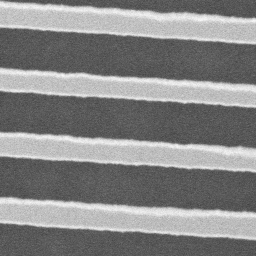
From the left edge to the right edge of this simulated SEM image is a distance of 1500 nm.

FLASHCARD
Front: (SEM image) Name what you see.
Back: lines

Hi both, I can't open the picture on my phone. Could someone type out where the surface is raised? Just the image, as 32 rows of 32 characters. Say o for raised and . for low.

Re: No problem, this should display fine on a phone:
oooo............................
ooooooooooooooooooo.............
oooooooooooooooooooooooooooooooo
...ooooooooooooooooooooooooooooo
.................ooooooooooooooo
................................
................................
................................
................................
ooooooooooooo...................
oooooooooooooooooooooooooooo....
....oooooooooooooooooooooooooooo
..................oooooooooooooo
................................
................................
................................
................................
oooooooooooooo..................
oooooooooooooooooooooooooooo....
.ooooooooooooooooooooooooooooooo
...............ooooooooooooooooo
................................
................................
................................
................................
ooooooooooo.....................
ooooooooooooooooooooooooooooo...
oooooooooooooooooooooooooooooooo
........oooooooooooooooooooooooo
.........................ooooooo
................................
................................